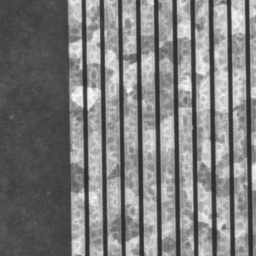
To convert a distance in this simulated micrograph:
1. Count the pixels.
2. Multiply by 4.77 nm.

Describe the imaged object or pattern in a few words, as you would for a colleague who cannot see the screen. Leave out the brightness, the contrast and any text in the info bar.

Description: parallel lines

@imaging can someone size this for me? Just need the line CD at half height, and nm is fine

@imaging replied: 61.5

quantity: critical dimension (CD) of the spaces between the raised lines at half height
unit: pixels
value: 5.01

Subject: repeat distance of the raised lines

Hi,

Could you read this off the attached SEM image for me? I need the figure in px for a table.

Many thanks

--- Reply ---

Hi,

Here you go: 18.1